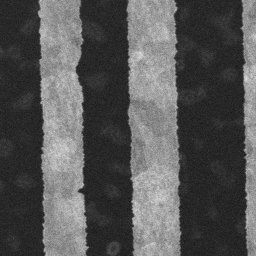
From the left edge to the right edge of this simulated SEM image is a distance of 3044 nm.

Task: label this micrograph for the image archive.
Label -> one or a few lines or trenches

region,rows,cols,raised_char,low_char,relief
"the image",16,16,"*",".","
..***...***....*
...**...***....*
...**...***....*
...**...***....*
...**...***....*
...**...***....*
...**...***....*
...**...***....*
...**...***....*
...**...***....*
...**...***....*
...**...***....*
...**...***....*
...**...***....*
...**...***....*
...**...***....*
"